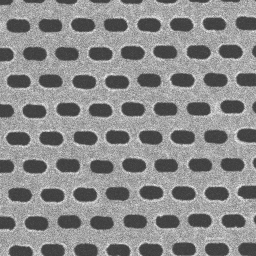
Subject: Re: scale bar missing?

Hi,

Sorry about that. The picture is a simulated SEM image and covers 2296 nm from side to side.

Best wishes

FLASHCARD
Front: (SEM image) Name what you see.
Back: a regular array of holes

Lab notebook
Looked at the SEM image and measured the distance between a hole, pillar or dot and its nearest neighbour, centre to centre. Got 286 nm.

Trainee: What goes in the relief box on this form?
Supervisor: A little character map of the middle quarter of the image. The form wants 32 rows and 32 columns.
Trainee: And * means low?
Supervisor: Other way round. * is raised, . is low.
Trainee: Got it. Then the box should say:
********************************
********************************
*******************....****....*
**......**......**......***.....
**......**......**......***.....
**......***.....***.....****....
********************************
********************************
********************************
****************.***************
....**......**......**......***.
....**......**......**.......**.
....**......***.....***.....***.
********************************
********************************
********************************
********************..******..**
**......**......***.....***.....
**......**.......**......**.....
***.....***.....***.....***.....
********************************
********************************
********************************
****************.***************
....***.....***.....***.....***.
....**......***......**......**.
....***.....***.....***.....****
********...*********************
********************************
********************************
********************..******..**
***.....***.....***......**.....